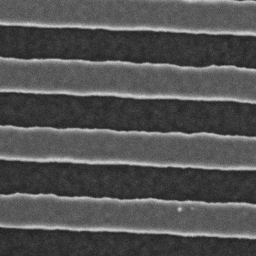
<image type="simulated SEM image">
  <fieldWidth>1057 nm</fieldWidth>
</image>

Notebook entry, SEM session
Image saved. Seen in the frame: lines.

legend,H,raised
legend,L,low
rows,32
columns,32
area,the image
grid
HHHHHHHHHHHHHHHHHHHHHHHHHHHHHHHH
HHHHHHHHHHHHHHHHHHHHHHHHHHHHHHHH
HHHHHHHHHHHHHHHHHHHHHHHHHHHHHHHH
LLLLLLLLLLHHHHHHHHHHHHHHHHHHHHHH
LLLLLLLLLLLLLLLLLLLLLLLLLLLLLLLL
LLLLLLLLLLLLLLLLLLLLLLLLLLLLLLLL
LLLLLLLLLLLLLLLLLLLLLLLLLLLLLLLL
HHHLHHHHLLLLLLLLLLLLLLLLLLLLLLLL
HHHHHHHHHHHHHHHHHHHHHHHHHHHHHHLL
HHHHHHHHHHHHHHHHHHHHHHHHHHHHHHHH
HHHHHHHHHHHHHHHHHHHHHHHHHHHHHHHH
LLHHHHHHHHHHHHHHHHHHHHHHHHHHHHHH
LLLLLLLLLLLLLLLLLLLLLLLLLHHHHHHH
LLLLLLLLLLLLLLLLLLLLLLLLLLLLLLLL
LLLLLLLLLLLLLLLLLLLLLLLLLLLLLLLL
LLLLLLLLLLLLLLLLLLLLLLLLLLLLLLLL
HHHHHHHHHHHHHHHHHHLLLLLLLLLLLLLL
HHHHHHHHHHHHHHHHHHHHHHHHHHHHHHHH
HHHHHHHHHHHHHHHHHHHHHHHHHHHHHHHH
HHHHHHHHHHHHHHHHHHHHHHHHHHHHHHHH
LLLLLLLLLLLLLLLLHHHHHHHHHHHHHHHH
LLLLLLLLLLLLLLLLLLLLLLLLLLLLLLLL
LLLLLLLLLLLLLLLLLLLLLLLLLLLLLLLL
LLLLLLLLLLLLLLLLLLLLLLLLLLLLLLLL
HHHHHHHLLLLLLLLLLLLLLLLLLLLLLLLL
HHHHHHHHHHHHHHHHHHHHHHHHHHHHHHHH
HHHHHHHHHHHHHHHHHHHHHHHHHHHHHHHH
HHHHHHHHHHHHHHHHHHHHHHHHHHHHHHHH
LLHHHHHHHHHHHHHHHHHHHHHHHHHHHHHH
LLLLLLLLLLLLLLLLLLLLLLLHLHHHHHHH
LLLLLLLLLLLLLLLLLLLLLLLLLLLLLLLL
LLLLLLLLLLLLLLLLLLLLLLLLLLLLLLLL